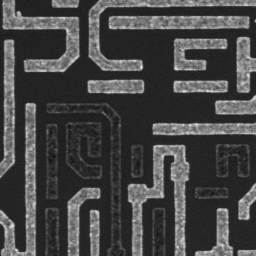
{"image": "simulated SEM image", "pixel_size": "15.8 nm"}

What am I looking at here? wiring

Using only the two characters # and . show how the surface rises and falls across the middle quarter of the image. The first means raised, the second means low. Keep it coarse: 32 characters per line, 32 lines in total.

#........##########.........####
............#####...............
................................
................................
......##############........####
......##############........####
......##############........####
................................
................................
................................
###########.....................
############....................
..........###...................
...........###..................
............##..................
.########...##........##########
.########...##........##########
.########...##..................
.###..###...##..................
.###..###...##..................
.###..###...##...##..........#..
.###..###...##...###..########..
.###..###...##...###..########..
.###........##...###..###...##..
.####.......##...###..###...##..
.#####......##...###..###..####.
...######...##...###..###..####.
....#####...##...###...##..####.
............##.........##..####.
............##.........##...##..
............##..####...##...##..
....#####...##..#########...##..